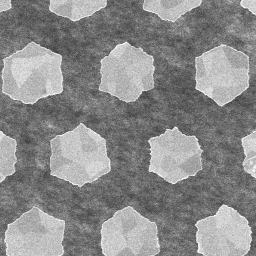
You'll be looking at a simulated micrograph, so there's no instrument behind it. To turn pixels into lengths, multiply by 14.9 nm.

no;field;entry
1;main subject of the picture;raised bodies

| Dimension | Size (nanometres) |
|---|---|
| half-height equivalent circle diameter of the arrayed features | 832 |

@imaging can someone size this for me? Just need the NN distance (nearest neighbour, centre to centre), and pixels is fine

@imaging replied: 94.7